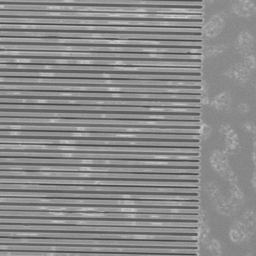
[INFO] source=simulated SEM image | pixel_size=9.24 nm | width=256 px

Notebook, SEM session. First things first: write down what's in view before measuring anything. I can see parallel lines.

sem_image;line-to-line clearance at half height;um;0.0231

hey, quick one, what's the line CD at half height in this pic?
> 38.1 nm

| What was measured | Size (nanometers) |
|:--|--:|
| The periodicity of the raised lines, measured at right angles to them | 61.8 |